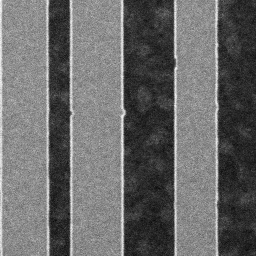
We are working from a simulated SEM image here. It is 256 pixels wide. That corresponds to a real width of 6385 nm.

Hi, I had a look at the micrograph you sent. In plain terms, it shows one or a few lines or trenches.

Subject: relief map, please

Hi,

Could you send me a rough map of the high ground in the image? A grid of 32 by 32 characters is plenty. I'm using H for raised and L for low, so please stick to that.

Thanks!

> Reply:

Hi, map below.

HHHHHHLLLHHHHHHLLLLLLLHHHHHLLLLL
HHHHHHLLLHHHHHHLLLLLLLHHHHHLLLLL
HHHHHHLLLHHHHHHLLLLLLLHHHHHLLLLL
HHHHHHLLLHHHHHHLLLLLLLHHHHHLLLLL
HHHHHHLLLHHHHHHLLLLLLLHHHHHLLLLL
HHHHHHLLLHHHHHHLLLLLLLHHHHHLLLLL
HHHHHHLLLHHHHHHLLLLLLLHHHHHLLLLL
HHHHHHLLLHHHHHHLLLLLLLHHHHHLLLLL
HHHHHHLLLHHHHHHLLLLLLLHHHHHLLLLL
HHHHHHLLLHHHHHHLLLLLLLHHHHHLLLLL
HHHHHHLLLHHHHHHLLLLLLLHHHHHLLLLL
HHHHHHLLLHHHHHHLLLLLLLHHHHHLLLLL
HHHHHHLLLHHHHHHLLLLLLLHHHHHLLLLL
HHHHHHLLLHHHHHHLLLLLLLHHHHHLLLLL
HHHHHHLLLHHHHHHLLLLLLLHHHHHLLLLL
HHHHHHLLLHHHHHHLLLLLLLHHHHHLLLLL
HHHHHHLLLHHHHHHLLLLLLLHHHHHLLLLL
HHHHHHLLLHHHHHHLLLLLLLHHHHHLLLLL
HHHHHHLLLHHHHHHLLLLLLLHHHHHLLLLL
HHHHHHLLLHHHHHHLLLLLLLHHHHHLLLLL
HHHHHHLLLHHHHHHLLLLLLLHHHHHLLLLL
HHHHHHLLLHHHHHHLLLLLLLHHHHHLLLLL
HHHHHHLLLHHHHHHLLLLLLLHHHHHLLLLL
HHHHHHLLLHHHHHHLLLLLLLHHHHHLLLLL
HHHHHHLLLHHHHHHLLLLLLLHHHHHLLLLL
HHHHHHLLLHHHHHHLLLLLLLHHHHHLLLLL
HHHHHHLLLHHHHHHLLLLLLLHHHHHLLLLL
HHHHHHLLLHHHHHHLLLLLLLHHHHHLLLLL
HHHHHHLLLHHHHHHLLLLLLLHHHHHLLLLL
HHHHHHLLLHHHHHHLLLLLLLHHHHHLLLLL
HHHHHHLLLHHHHHHLLLLLLLHHHHHLLLLL
HHHHHHLLLHHHHHHLLLLLLLHHHHHLLLLL